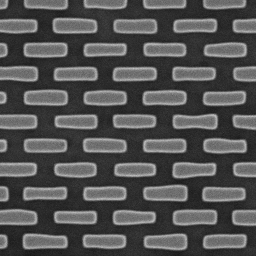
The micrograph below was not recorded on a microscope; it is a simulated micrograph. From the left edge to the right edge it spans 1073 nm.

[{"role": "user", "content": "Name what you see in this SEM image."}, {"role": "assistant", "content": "groups of lines, slits or small figures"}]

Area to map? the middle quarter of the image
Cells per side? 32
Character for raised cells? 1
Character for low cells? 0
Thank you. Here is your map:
00000000000000000000000000000000
11111111000001111111111000011111
11111111000011111111111000011111
11111111000011111111111000011111
00000000000000000000000000000000
00000000000000000000000000000000
00000000000000000000000000000000
10000111111111100000111111111100
10000111111111110000111111111100
10000111111111100000111111111100
00000000000000000000000000000000
00000000000000000000000000000000
00000000000000000000000000000000
11111111000011111111111000011111
11111111000011111111111000011111
11111111000001111111111000011111
00000000000000000000000000000000
00000000000000000000000000000000
00000000000000000000000000000000
00000111111111100000111111111100
10000111111111100000111111111100
00000111111111100000111111111100
00000000000000000000000000000000
00000000000000000000000000000000
00000000000000000000000000000000
11111111000001111111111000011111
11111111000001111111111000011111
11111111000001111111111000011111
00000000000000000000000000000000
00000000000000000000000000000000
00000000000000000000000000011100
10000111111111100000111111111110